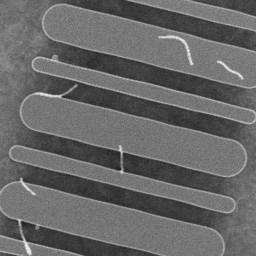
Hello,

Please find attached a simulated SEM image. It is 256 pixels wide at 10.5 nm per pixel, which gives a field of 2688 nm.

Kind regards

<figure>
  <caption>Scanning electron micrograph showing groups of lines, slits or small figures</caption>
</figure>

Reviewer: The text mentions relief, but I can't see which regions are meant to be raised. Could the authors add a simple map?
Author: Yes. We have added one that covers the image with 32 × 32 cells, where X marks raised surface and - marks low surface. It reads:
------------------XXXXXXXX------
------XXXXXX----------XXXXXXXX--
-----XXXXXXXXXXX----------XXXXXX
-----XXXXXXXXXXXXXXX----------XX
------XXXXXXXXXXXXXXXXXX--------
---------XXXXXXXXXXXXXXXXXXX----
------------XXXXXXXXXXXXXXXXXXXX
----XXX----------XXXXXXXXXXXXXXX
----XXXXXXX----------XXXXXXXXXXX
-------XXXXXXXX----------XXXXXXX
-----------XXXXXXXX---------XXXX
---------------XXXXXXXX---------
---XXXXXX----------XXXXXXXX-----
---XXXXXXXXXX----------XXXXXXX--
---XXXXXXXXXXXXXX----------XXXXX
---XXXXXXXXXXXXXXXXXX-----------
-----XXXXXXXXXXXXXXXXXXXX-------
---------XXXXXXXXXXXXXXXXXXXX---
--XX---------XXXXXXXXXXXXXXXXX--
-XXXXXXX---------XXXXXXXXXXXXXX-
---XXXXXXXXX----------XXXXXXXXX-
-------XXXXXXXXX---------XXXXX--
-----------XXXXXXXX-------------
XXXXXX---------XXXXXXXX---------
XXXXXXXXXX----------XXXXXXXX----
XXXXXXXXXXXXXX----------XXXXX---
XXXXXXXXXXXXXXXXXX----------X---
--XXXXXXXXXXXXXXXXXXXX----------
------XXXXXXXXXXXXXXXXXXXX------
----------XXXXXXXXXXXXXXXXXX----
XXXX----------XXXXXXXXXXXXXX----
XXXXXXXXX----------XXXXXXXXX----